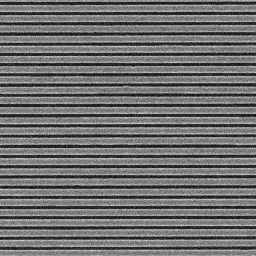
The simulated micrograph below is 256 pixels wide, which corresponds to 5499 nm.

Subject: parallel lines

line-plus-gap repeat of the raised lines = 219 nm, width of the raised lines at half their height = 137 nanometres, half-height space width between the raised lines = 75.2 nanometres